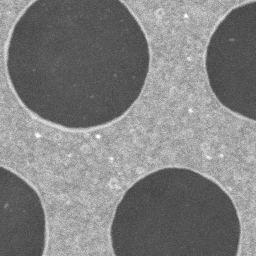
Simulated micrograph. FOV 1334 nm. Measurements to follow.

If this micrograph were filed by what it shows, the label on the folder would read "holes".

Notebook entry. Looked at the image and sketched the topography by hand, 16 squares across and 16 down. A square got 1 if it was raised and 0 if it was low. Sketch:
1100000011111110
1000000001111100
1000000001111000
0000000001111000
0000000001111000
1000000001111000
1000000011111100
1110000111111111
1111111111111111
1111111111111111
1111111111001111
0011111100000011
0001111100000011
0001111000000001
0001111000000001
0001111000000001